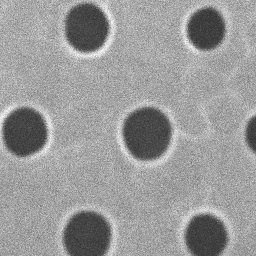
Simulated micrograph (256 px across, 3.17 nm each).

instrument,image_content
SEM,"holes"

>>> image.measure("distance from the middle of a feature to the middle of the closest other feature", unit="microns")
0.38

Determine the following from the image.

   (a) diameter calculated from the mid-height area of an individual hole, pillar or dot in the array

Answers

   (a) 154 nm